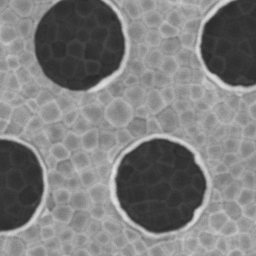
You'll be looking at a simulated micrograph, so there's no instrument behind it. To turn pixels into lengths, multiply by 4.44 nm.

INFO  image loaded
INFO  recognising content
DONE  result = holes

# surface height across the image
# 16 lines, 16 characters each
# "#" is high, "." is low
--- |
###....#######..
##......#####...
##......#####...
##......#####...
###....######...
####..##########
################
################
################
..######....####
...####.....####
...####......###
...####......###
..######....####
################
################